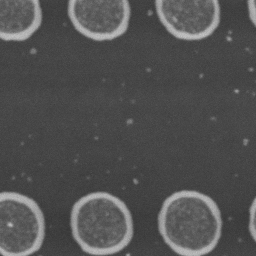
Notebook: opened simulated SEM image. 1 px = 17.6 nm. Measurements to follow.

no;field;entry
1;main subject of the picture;raised bodies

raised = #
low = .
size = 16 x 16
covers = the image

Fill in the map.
##..####..####..
##...###..###...
................
................
................
................
................
................
................
................
................
................
#....##....##...
##...###..####..
###..###..####..
##...##....##...